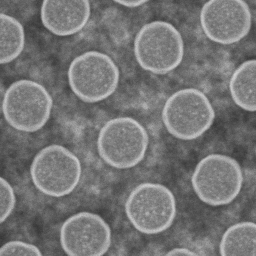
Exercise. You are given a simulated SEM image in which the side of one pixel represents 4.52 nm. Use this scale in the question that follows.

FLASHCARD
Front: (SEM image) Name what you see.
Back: a regular array of raised bodies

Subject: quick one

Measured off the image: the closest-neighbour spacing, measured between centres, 325 nm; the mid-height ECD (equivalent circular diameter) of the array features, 212 nm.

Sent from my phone